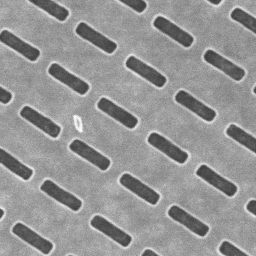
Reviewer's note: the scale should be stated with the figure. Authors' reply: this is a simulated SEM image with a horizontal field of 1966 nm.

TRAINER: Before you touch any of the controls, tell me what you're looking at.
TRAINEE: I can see a regular array of holes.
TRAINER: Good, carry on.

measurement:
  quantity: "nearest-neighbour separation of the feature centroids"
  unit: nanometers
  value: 382